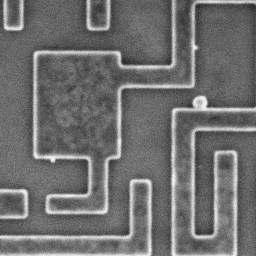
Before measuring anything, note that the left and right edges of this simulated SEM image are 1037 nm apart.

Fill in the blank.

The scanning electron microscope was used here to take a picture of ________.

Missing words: wiring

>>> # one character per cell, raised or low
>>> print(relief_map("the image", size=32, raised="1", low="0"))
01100000000111000000001110000000
01100000000111000000001100000000
01100000000111000000001100000000
01100000000110000000001100000000
00000000000000000000001100000000
00000000000000000000001100000000
00000111111111100000001100000000
00001111111111100000001100000000
00001111111111111111111100000000
00001111111111111111111100000000
00001111111111111111111100000000
00001111111111100000000000000000
00001111111111100000000000000000
00001111111111100000000011000000
00001111111111100000001111111111
00001111111111100000001111111111
00001111111111100000001100000000
00001111111111100000001100000000
00001111111111100000001100000000
00000111111111100000001100011100
00000000000110000000001100011100
00000000000110000000001100011100
00000000000110000000001100011100
00000000000110001110001100011100
11100011111110001110001100011100
11100011111110001110001100011100
11100011111110001110001100011100
00000000000000001110001100011100
00000000000000001110001100011100
00000000000000001110001110111100
11111111111111111110001111111100
11111111111111111110001111111100